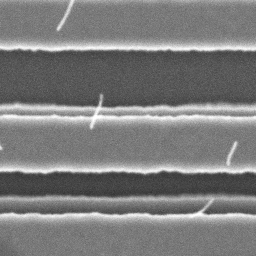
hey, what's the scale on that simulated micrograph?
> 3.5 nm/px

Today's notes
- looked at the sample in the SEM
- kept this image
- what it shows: lines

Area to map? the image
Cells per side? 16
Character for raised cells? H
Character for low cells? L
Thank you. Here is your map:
HHHHHHHHHHHHHHHH
HHHHHHHHHHHHHHHH
HHHHHHHHHHHHHHHH
LLLLLLLLLLLLLLLL
LLLLLLLLLLLLLLLL
LLLLLLLLLLLLLLLL
LLLLLLLLLLLLLLLL
HHHHHHHHHHHHHHHH
HHHHHHHHHHHHHHHH
HHHHHHHHHHHHHHHH
HHHHHHHHHHHHHHHH
LLLLLLLLLLLLLLLL
LLLLLLLLLLLLLLLL
HHHHHHHHHHHHHHHH
HHHHHHHHHHHHHHHH
HHHHHHHHHHHHHHHH